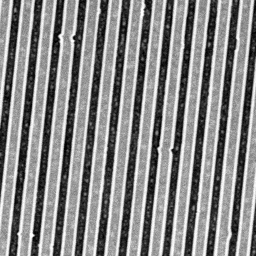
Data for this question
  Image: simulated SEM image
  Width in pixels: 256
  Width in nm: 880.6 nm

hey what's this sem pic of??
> parallel lines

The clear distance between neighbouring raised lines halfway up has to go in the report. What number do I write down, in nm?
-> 33.3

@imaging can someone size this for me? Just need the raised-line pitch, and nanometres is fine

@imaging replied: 75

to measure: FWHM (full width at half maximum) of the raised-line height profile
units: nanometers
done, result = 39.3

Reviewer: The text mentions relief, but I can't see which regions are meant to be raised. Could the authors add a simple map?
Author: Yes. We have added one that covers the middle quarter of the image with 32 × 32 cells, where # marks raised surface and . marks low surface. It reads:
##..###...###..###...###..###...
##..###...##...###...##...###...
##..###...##...###..###...###..#
#...###...##...###..###...###..#
#...###..###...###..###...###..#
#...###..###...###..###...###..#
#...###..###...##...###...##...#
#...###..###..###...###..###...#
#...##...###..###...###..###...#
#..###...###..###...###..###...#
#..###...###..###...###..###...#
#..###...##...###...##...###...#
#..###...##...###..###...###..##
...###...##...###...##...###..##
...###..###...###..###...###..##
...###..###...###..###...###..##
...##...###...###..###...##...##
...##...###...##...###..###...##
...##...###...##...###..###...##
..###...###..###...###..###...##
..###...###..###...###..###...##
..###...##...###...##...###...##
..###...##...###..###...###..###
..###...##...###..###...###..###
..###..###...###..###...###..###
..##...###...###..###...###..###
..##...###...##...###...##...###
..##...###...##...###..###...###
.###...###...##...###..###...###
.###...###..###...###..###...###
.###...##...###...##...###...###
.###...##...###...##...###...##.